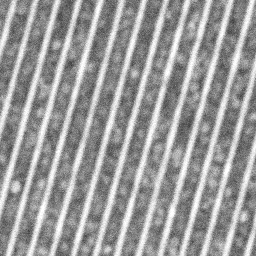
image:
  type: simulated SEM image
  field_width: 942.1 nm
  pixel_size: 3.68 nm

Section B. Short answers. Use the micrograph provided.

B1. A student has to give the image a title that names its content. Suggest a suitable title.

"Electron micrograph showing parallel lines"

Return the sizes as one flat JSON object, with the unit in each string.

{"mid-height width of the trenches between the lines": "62.5 nanometers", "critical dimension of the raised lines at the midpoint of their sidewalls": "0.0147 µm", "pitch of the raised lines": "76.8 nm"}